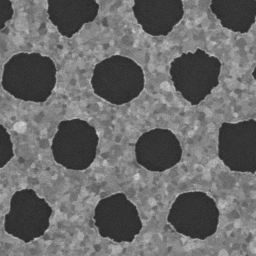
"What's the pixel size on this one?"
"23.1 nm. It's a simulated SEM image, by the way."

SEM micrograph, a regular array of holes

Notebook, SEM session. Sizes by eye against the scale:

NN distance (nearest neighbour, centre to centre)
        1790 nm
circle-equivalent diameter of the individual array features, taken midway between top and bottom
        1.16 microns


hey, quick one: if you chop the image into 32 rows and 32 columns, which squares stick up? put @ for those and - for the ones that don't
--@@@@------@@@@@------@@@------
--@@@@------@@@@@------@@@@-----
-@@@@@------@@@@@------@@@@-----
@@@@@@@---@@@@@@@@----@@@@@@---@
@@@@@@@@-@@@@@@@@@@-@@@@@@@@@@@@
@@@@@@@@@@@@@@@@@@@@@@@@@@@@@@@@
@@@@@@@@@@@@@@@@@@@@@@@@--@@@@@@
@------@@@@@@----@@@@@-----@@@@@
-------@@@@@------@@@-------@@@@
-------@@@@-------@@@------@@@@@
-------@@@@-------@@@@-----@@@@@
@------@@@@@------@@@@----@@@@@@
@@@---@@@@@@@----@@@@@@--@@@@@@@
@@@@@@@@@@@@@@@@@@@@@@@@@@@@@@@@
@@@@@@@@@@@@@@@@@@@@@@@@@@@@@@@@
@@@@@@@----@@@@@@@@@@@@@@@@@----
-@@@@@@-----@@@@@@----@@@@@-----
-@@@@@@-----@@@@@-----@@@@@-----
--@@@@------@@@@@------@@@@-----
--@@@@@-----@@@@@------@@@@-----
-@@@@@@----@@@@@@-----@@@@@@----
@@@@@@@@@@@@@@@@@@@@@@@@@@@@@@--
@@@@@@@@@@@@@@@@@@@@@@@@@@@@@@@@
@@@@@@@@@@@@@@@@@@@@@@@@@@@@@@@@
@@---@@@@@@@@@--@@@@@@----@@@@@@
@-----@@@@@@-----@@@@@-----@@@@@
@-----@@@@@@-----@@@@------@@@@@
@-----@@@@@@------@@@------@@@@@
@-----@@@@@@------@@@@-----@@@@@
@----@@@@@@@@----@@@@@@---@@@@@@
@@@@@@@@@@@@@@@@@@@@@@@@@@@@@@@@
@@@@@@@@@@@@@@@@@@@@@@@@@@@@@@@@